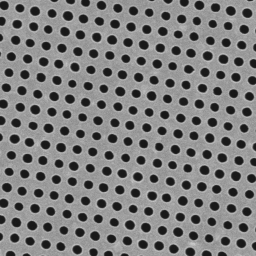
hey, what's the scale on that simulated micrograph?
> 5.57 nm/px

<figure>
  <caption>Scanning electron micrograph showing a regular array of holes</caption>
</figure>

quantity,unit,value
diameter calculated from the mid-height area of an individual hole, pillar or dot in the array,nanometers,51.4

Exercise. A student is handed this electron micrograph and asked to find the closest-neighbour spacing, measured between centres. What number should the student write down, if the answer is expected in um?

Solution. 0.0871